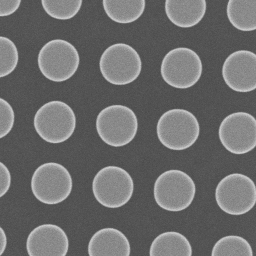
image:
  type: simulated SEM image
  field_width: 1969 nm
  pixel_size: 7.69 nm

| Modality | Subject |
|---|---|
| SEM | an array of small figures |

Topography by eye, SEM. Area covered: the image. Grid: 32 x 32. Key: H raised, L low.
HHLLLHHHHHLLLHHHHHLLLHHHHHLLLHHH
HHLLLLHHHHLLLHHHHHLLLHHHHHLLHHHH
LLLLLLLLLLLLLLHHHLLLLHHHHLLLLHHH
LLLLLLLLLLLLLLLLLLLLLLLLLLLLLLHH
LLLLLLLLLLLLLLLLLLLLLLLLLLLLLLLL
HHLLLLHHHLLLLLLHLLLLLLLLLLLLLLLL
HHLLLHHHHHLLLHHHHLLLLHHHLLLLLHHL
HHLLLHHHHHLLLHHHHHLLHHHHHLLLHHHH
HHLLLHHHHHLLLHHHHHLLHHHHHLLLHHHH
HLLLLLHHHLLLLHHHHLLLHHHHHLLLHHHH
LLLLLLLLLLLLLLHHLLLLLHHHLLLLHHHH
LLLLLLLLLLLLLLLLLLLLLLLLLLLLLLLL
LLLLLLLLLLLLLLLLLLLLLLLLLLLLLLLL
HLLLLHHHHLLLLHHHLLLLLLLLLLLLLLLL
HHLLHHHHHLLLHHHHHLLLHHHHLLLLLHHL
HHLLHHHHHLLLHHHHHLLLHHHHHLLLHHHH
HLLLLHHHHLLLHHHHHLLLHHHHHLLHHHHH
LLLLLLHHLLLLLHHHLLLLHHHHLLLLHHHH
LLLLLLLLLLLLLLLLLLLLLHHLLLLLHHHH
LLLLLLLLLLLLLLLLLLLLLLLLLLLLLLLL
LLLLLLHLLLLLLLLLLLLLLLLLLLLLLLLL
HLLLHHHHHLLLHHHHLLLLLHHLLLLLLLLL
HLLLHHHHHLLLHHHHLLLLHHHHLLLLHHHL
HLLLHHHHHLLLHHHHHLLHHHHHLLLHHHHH
LLLLHHHHLLLLHHHHLLLHHHHHLLLHHHHH
LLLLLLHLLLLLLHHLLLLLHHHHLLLHHHHH
LLLLLLLLLLLLLLLLLLLLLLLLLLLLHHHL
LLLLLLLLLLLLLLLLLLLLLLLLLLLLLLLL
LLLLLHHHLLLLLLLLLLLLLLLLLLLLLLLL
HLLLHHHHLLLLHHHHLLLLHHHLLLLLLLLL
HLLHHHHHLLLHHHHHLLLHHHHHLLLHHHHL
LLLHHHHHLLLHHHHHLLLHHHHHLLLHHHHH